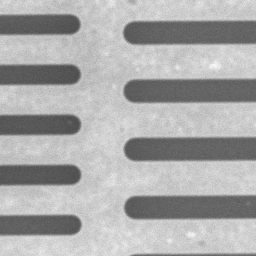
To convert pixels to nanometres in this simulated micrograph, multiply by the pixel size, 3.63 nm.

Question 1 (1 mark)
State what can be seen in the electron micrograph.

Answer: groups of lines, slits or small figures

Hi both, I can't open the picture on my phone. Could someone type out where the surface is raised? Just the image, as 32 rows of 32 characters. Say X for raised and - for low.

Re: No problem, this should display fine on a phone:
XXXXXXXXXXXXXXXXXXXXXXXXXXXXXXXX
XXXXXXXXXXXXXXXXXXXXXXXXXXXXXXXX
----------XXXXXXX---------------
----------XXXXX-----------------
XXXXXXXXXXXXXXX-----------------
XXXXXXXXXXXXXXXX----------------
XXXXXXXXXXXXXXXXXXXXXXXXXXXXXXXX
XXXXXXXXXXXXXXXXXXXXXXXXXXXXXXXX
----------XXXXXXXXXXXXXXXXXXXXXX
----------XXXXXXXXXXXXXXXXXXXXXX
---------XXXXXXX----------------
XXXXXXXXXXXXXXX-----------------
XXXXXXXXXXXXXXXX----------------
XXXXXXXXXXXXXXXXXXXXXXXXXXXXXXXX
----------XXXXXXXXXXXXXXXXXXXXXX
----------XXXXXXXXXXXXXXXXXXXXXX
----------XXXXXXXXXXXXXXXXXXXXXX
XXXXXXXXXXXXXXXX----------------
XXXXXXXXXXXXXXX-----------------
XXXXXXXXXXXXXXXX----------------
XXXXXXXXXXXXXXXXXXXXXXXXXXXXXXXX
----------XXXXXXXXXXXXXXXXXXXXXX
----------XXXXXXXXXXXXXXXXXXXXXX
XXXXXXXXXXXXXXXXXXXXXXXXXXXXXXXX
XXXXXXXXXXXXXXXX----------------
XXXXXXXXXXXXXXXX----------------
XXXXXXXXXXXXXXXX----------------
----------XXXXXXX--------XXXXXXX
----------XXXXXXXXXXXXXXXXXXXXXX
---------XXXXXXXXXXXXXXXXXXXXXXX
XXXXXXXXXXXXXXXXXXXXXXXXXXXXXXXX
XXXXXXXXXXXXXXXXXXXXXXXXXXXXXXXX